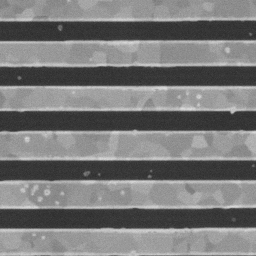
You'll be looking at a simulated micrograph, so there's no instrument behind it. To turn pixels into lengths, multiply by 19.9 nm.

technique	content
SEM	lines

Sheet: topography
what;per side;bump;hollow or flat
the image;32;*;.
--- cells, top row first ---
********************************
********************************
***********************.........
................................
................................
********************************
********************************
********************************
................................
................................
................................
********************************
********************************
********************************
................................
................................
*.******************************
********************************
********************************
********************************
................................
................................
................................
********************************
********************************
********************************
................................
................................
................................
********************************
********************************
********************************